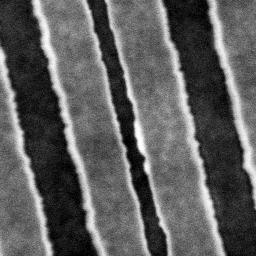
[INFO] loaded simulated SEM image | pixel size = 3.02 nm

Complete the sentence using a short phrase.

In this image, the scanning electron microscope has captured lines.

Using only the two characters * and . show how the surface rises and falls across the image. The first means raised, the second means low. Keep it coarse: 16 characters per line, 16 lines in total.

..********...***
...*******...***
...********...**
...********...**
...********...**
*...*******...**
*...********...*
*...********...*
*...********...*
*...********...*
**...********...
**...********...
**...********...
***...*******...
***...********..
***...********..